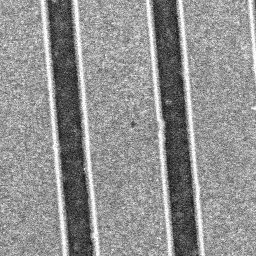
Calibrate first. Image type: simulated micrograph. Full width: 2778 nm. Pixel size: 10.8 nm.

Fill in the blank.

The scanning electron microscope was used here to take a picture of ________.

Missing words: one or a few lines or trenches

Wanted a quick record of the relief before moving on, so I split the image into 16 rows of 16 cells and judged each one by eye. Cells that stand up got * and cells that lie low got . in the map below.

***..****..*****
***..****..*****
***..****..*****
***..*****..****
***..*****..****
***..*****..****
***..*****..****
***..*****..****
***..*****..****
***..*****..****
****..****..****
****..****..****
****..****..****
****..****..****
****..*****..***
****..*****..***